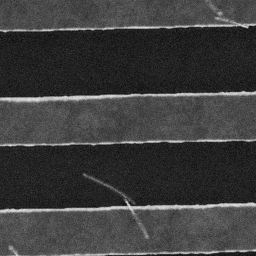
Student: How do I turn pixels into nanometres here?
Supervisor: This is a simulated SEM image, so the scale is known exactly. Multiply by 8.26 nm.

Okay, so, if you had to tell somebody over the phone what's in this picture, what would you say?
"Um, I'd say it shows lines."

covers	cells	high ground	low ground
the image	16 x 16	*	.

****************
****************
................
................
................
................
****************
****************
****************
................
................
................
................
****************
****************
****************